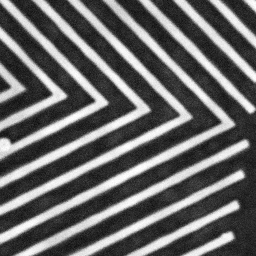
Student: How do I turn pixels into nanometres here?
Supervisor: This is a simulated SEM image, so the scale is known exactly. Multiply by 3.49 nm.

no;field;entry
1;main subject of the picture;groups of lines, slits or small figures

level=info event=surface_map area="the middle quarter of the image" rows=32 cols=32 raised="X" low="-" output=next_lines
XX------XXX------XXX------XX----
-XX------XXX------XXX------XXX--
--XX------XXX------XXX------XXX-
--XXX------XXX------XXX------XX-
----XX------XXX------XXX------XX
----XXX------XXX------XXX------X
-----XXX------XXX------XXX------
------XXX------XXX------XXX-----
-------XXX------XXX------XXX----
--------XXX------XXX------XXX---
------XXXX--------XXX------XXX--
----XXXX----------XXXX------XX--
--XXXX----------XXXX---------XX-
XXXX----------XXXX----------XXXX
XX----------XXXXX---------XXXX--
----------XXXX----------XXXX----
--------XXXX----------XXXX------
------XXXX----------XXXX--------
----XXXX----------XXXX----------
--XXXX----------XXXX----------XX
XXXX----------XXXX----------XXXX
XX----------XXXXX---------XXXXX-
X---------XXXX----------XXXXX---
--------XXXXX---------XXXXX-----
------XXXX----------XXXXX-------
----XXXX----------XXXX----------
--XXXX----------XXXX----------XX
XXXX----------XXXX----------XXXX
XXX---------XXXX----------XXXXX-
X---------XXXXX---------XXXXX---
---------XXXX---------XXXXX-----
------XXXX----------XXXXX-------